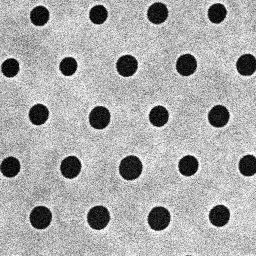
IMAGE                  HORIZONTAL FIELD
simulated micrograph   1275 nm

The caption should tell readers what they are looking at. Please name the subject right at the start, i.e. a regular array of holes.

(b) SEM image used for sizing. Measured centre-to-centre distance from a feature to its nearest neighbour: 0.288 µm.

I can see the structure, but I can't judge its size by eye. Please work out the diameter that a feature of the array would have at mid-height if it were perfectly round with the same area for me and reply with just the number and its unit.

109 nanometers